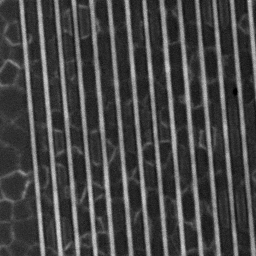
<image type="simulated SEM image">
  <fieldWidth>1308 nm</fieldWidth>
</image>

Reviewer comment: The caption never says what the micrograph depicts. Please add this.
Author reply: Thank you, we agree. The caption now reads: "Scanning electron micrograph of parallel lines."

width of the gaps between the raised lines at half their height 14.4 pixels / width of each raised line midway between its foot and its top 14.6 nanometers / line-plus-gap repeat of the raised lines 89.3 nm